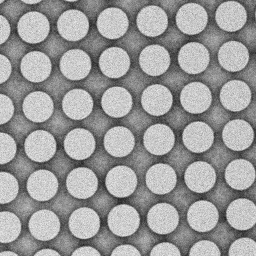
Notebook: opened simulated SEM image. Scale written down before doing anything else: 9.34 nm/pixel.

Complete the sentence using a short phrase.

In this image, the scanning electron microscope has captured an array of small figures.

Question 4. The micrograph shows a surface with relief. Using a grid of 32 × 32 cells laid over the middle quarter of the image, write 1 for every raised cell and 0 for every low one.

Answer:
11111110011111110001111111000111
11111100011111110000111111000011
11111100001111100000011100000000
01111000000000000000000000000000
00000000000000000000000000000000
00000000000000000000001110000001
00110000000111100000111111000011
01111100001111110000111111100111
11111110001111111001111111100111
11111110011111111001111111100111
11111110001111111000111111100011
11111110001111110000111111000011
11111100000111100000001110000000
00111000000000000000000000000000
00000000000000000000000000000000
00000000000000000000001111000001
00111000000111110000011111100011
01111110000111111000111111100011
11111110001111111000111111100011
11111111001111111000111111100011
11111111001111111000111111100011
11111110000111111000011111100001
01111110000011110000000110000000
00111100000000000000000000000000
00000000000000000000000000000000
00000000000000000000001111000001
00011100000011111000011111100001
01111111000111111100011111110011
01111111000111111100011111110011
01111111000111111100011111110011
01111111000111111100011111110001
01111111000111111100001111100000